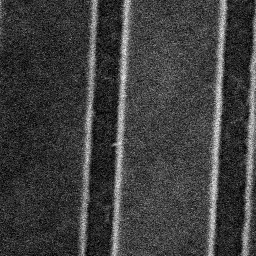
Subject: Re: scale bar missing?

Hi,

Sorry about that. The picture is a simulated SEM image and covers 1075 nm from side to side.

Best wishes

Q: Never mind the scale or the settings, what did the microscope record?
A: one or a few lines or trenches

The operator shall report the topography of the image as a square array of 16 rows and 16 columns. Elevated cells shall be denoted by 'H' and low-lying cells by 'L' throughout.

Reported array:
HHHHHHLLHHHHHHLL
HHHHHHLLHHHHHHLL
HHHHHHLLHHHHHHLL
HHHHHHLLHHHHHHLL
HHHHHHLLHHHHHHLL
HHHHHHLLHHHHHHLL
HHHHHHLLHHHHHHLL
HHHHHHLLHHHHHHLL
HHHHHHLHHHHHHHLL
HHHHHHLHHHHHHHLL
HHHHHLLHHHHHHLLL
HHHHHLLHHHHHHLLL
HHHHHLLHHHHHHLLH
HHHHHLLHHHHHHLLH
HHHHHLLHHHHHHLLH
HHHHHLLHHHHHHLLH